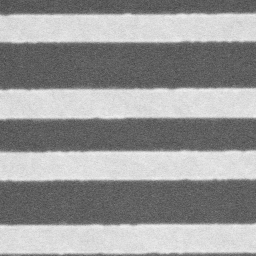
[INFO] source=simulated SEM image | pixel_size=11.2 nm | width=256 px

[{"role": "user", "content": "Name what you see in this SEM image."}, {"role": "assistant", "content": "lines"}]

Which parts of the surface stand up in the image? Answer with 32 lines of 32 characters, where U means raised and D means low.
DDDDDDDDDDDDDDDDDDDDDDDDDDDDDDDD
DDDDDDDDDDDDDDDDDDDDDDDDDDDDDDDD
UUUUUUUUUUUUUUUUUUUUUUUUUUUUUUUU
UUUUUUUUUUUUUUUUUUUUUUUUUUUUUUUU
UUUUUUUUUUUUUUUUUUUUUUUUUUUUUUUU
DDDDDDDDDDDDDDDDDDDDDDDDDDDDDDDD
DDDDDDDDDDDDDDDDDDDDDDDDDDDDDDDD
DDDDDDDDDDDDDDDDDDDDDDDDDDDDDDDD
DDDDDDDDDDDDDDDDDDDDDDDDDDDDDDDD
DDDDDDDDDDDDDDDDDDDDDDDDDDDDDDDD
DDDDDDDDDDDDDDDDDDDDDDDDDDDDDDDD
UUUUUUUUUUUUUUUUUUUUUUUUUUUUUUUU
UUUUUUUUUUUUUUUUUUUUUUUUUUUUUUUU
UUUUUUUUUUUUUUUUUUUUUUUUUUUUUUUU
UUUUUUUUUUUUUUUUUUUUUUUUUUUUUUUU
DDDDDDDDDDDDDDDDDDDDDDDDDDDDDDDD
DDDDDDDDDDDDDDDDDDDDDDDDDDDDDDDD
DDDDDDDDDDDDDDDDDDDDDDDDDDDDDDDD
DDDDDDDDDDDDDDDDDDDDDDDDDDDDDDDD
UUUUUUUUUUUUUUUUUUUUUUUUUUUUUUUU
UUUUUUUUUUUUUUUUUUUUUUUUUUUUUUUU
UUUUUUUUUUUUUUUUUUUUUUUUUUUUUUUU
DDDDDDDDDDDDDDDDDDDDDDDDDDDDDDDD
DDDDDDDDDDDDDDDDDDDDDDDDDDDDDDDD
DDDDDDDDDDDDDDDDDDDDDDDDDDDDDDDD
DDDDDDDDDDDDDDDDDDDDDDDDDDDDDDDD
DDDDDDDDDDDDDDDDDDDDDDDDDDDDDDDD
DDDDDDDDDDDDDDDDDDDDDDDDDDDDDDDD
UUUUUUUUUUUUUUUUUUUUUUUUUUUUUUUU
UUUUUUUUUUUUUUUUUUUUUUUUUUUUUUUU
UUUUUUUUUUUUUUUUUUUUUUUUUUUUUUUU
UUUUUUUUUUUUUUUUUUUDUUUDDDDDDDDD